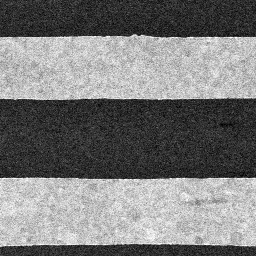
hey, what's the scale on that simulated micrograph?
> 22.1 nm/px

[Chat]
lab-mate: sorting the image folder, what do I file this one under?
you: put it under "one or a few lines or trenches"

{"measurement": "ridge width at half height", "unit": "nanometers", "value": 1400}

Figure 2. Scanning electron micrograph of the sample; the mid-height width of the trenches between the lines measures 1770 nm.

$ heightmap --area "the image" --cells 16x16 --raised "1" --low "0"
0000000000000000
0000000000000000
1111111111111111
1111111111111111
1111111111111111
1111111111111111
0000000000000000
0000000000000000
0000000000000000
0000000000000000
0000000000000000
1111111111111111
1111111111111111
1111111111111111
1111111111111111
0000000000000000